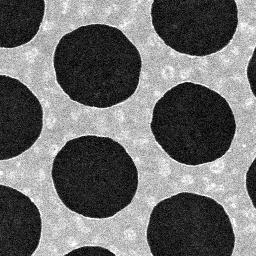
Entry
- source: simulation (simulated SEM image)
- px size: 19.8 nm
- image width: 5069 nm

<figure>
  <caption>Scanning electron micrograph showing holes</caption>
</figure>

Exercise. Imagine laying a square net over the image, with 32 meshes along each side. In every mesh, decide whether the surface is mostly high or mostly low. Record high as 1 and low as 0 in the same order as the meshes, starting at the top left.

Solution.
00000011111111111110000000000011
00000011111111111110000000000011
00000111111111111110000000000011
00000111110000011110000000000011
00001111000000001111000000000111
00011110000000000111100000001111
11111110000000000111110000011111
11111110000000000011111111111110
11111110000000000011111111111110
01111110000000000111111111111110
00011110000000000111110001111110
00001111000000000111100000011111
00000111100000001111000000001111
00000111111111111110000000000111
00000111111111111110000000000111
00000111111111111110000000000011
00000111111111111110000000000111
00000111100000111110000000000111
00001111000000001111000000000111
00111110000000001111100000001111
11111110000000000111111001111110
11111100000000000111111111111110
11111110000000000111111111111110
00111110000000000111111111111110
00011110000000000111110000111110
00001111000000001111000000011111
00000111100000011110000000001111
00000111111111111110000000000111
00000111111111111100000000000111
00000111111111111100000000000111
00000111111111111110000000000111
00001111100000111110000000000111